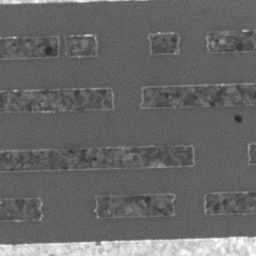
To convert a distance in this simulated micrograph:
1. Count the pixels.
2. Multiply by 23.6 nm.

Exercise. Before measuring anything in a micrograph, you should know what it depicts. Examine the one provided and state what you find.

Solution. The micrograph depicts parallel lines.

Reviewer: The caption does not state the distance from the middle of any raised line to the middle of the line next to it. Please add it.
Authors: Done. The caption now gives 1280 nm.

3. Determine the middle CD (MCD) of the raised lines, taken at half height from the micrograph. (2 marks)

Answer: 499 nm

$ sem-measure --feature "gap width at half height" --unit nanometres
779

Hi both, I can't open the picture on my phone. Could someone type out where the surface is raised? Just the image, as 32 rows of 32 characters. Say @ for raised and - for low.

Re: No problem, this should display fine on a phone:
--------------------------------
--------------------------------
--------------------------------
--------------------------------
-------------------@@@----@@@@@@
@@@@@@@-@@@@-------@@@----@@@@@@
@@@@@@@-@@@@-------@@@----------
--------------------------------
--------------------------------
--------------------------------
------------------------------@-
@@@@@@@@@@@@@@----@@@@@@@@@@@@@@
@@@@@@@@@@@@@@----@@@@@@@@@@@@@@
@@@@@@@@@@@@@@------------------
--------------------------------
--------------------------------
--------------------------------
--------------------------------
----------------@@@@@@@@-------@
@@@@@@@@@@@@@@@@@@@@@@@@-------@
@@@@@@@@@@@@@@@@@@@@@@@@--------
--------------------------------
--------------------------------
--------------------------------
---------------@@@@@@@----@@@@@@
@@@@@-------@@@@@@@@@@----@@@@@@
@@@@@-------@@@@@@@@@@----@@@@@@
@@@-----------------------------
--------------------------------
--------------------------------
----------@@@@@@@@@@@@@@@@@@@@@@
@@@@@@@@@@@@@@@@@@@@@@@@@@@@@@@@